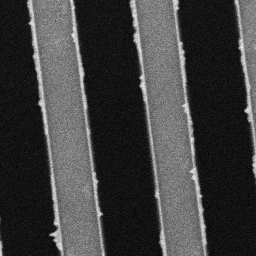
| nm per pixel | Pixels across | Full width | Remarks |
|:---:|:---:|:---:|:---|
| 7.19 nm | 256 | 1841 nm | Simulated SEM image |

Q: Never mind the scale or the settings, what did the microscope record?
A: one or a few lines or trenches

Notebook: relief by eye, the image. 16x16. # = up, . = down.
##..####...####.
##...####..####.
##...####..####.
##...####..####.
###..####..####.
###..####...####
###..####...####
###..####...####
###...###...####
###...####..####
###...####..####
###...####..####
###...####..####
####..####...###
####..####...###
####..####...###